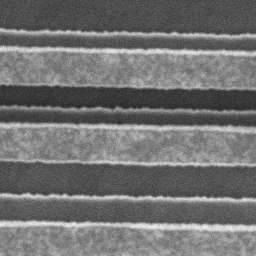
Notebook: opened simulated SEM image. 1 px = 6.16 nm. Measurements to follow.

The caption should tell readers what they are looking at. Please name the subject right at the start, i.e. lines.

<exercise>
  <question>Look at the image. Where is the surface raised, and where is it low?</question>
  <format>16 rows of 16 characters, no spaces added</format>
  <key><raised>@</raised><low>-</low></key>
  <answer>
----------------
----------------
----------------
@@@@@@@@@@@@@@@@
@@@@@@@@@@@@@@@@
--------------@@
----------------
----------------
@@@@@@@@@@@@@@@@
@@@@@@@@@@@@@@@@
----------------
----------------
----------------
----------------
@@@@@@@@@@@@@@@@
@@@@@@@@@@@@@@@@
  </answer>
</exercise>